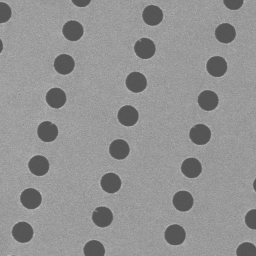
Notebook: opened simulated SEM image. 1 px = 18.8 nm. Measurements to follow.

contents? a regular array of holes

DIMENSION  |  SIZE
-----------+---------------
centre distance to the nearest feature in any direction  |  651 nanometres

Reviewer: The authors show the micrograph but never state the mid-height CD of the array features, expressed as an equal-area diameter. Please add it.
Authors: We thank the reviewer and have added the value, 392 nm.